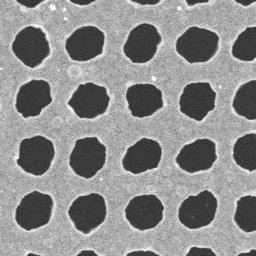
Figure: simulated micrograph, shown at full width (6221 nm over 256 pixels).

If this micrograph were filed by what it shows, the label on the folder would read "a regular array of holes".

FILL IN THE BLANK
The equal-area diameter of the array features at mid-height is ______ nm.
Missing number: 912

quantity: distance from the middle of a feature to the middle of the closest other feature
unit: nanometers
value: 1310